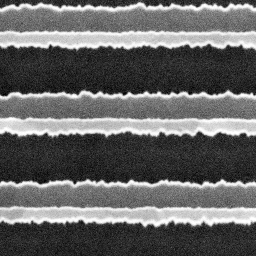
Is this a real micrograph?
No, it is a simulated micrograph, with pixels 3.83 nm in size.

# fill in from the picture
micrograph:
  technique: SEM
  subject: lines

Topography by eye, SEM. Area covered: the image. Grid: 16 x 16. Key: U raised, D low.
UUUUUUUUUUUUUUUU
UUUUUUUUUUUUUUUU
UUUUUUUUUUUUUUUU
DDDDDDDDDDDDDDDD
DDDDDDDDDDDDDDDD
DDDDDDDDDDDDDDDD
UUUUUUUUUUUUUUUU
UUUUUUUUUUUUUUUU
DDDDDDDDDDDDDDDD
DDDDDDDDDDDDDDDD
DDDDDDDDDDDDDDDD
UUDUUUUUUDUUDUUU
UUUUUUUUUUUUUUUU
UUUUUUUUUUUUUUUU
DDDDDDDDDDDDDDDD
DDDDDDDDDDDDDDDD